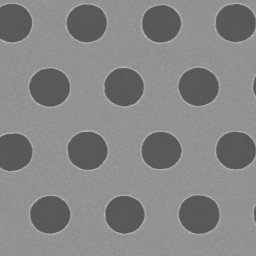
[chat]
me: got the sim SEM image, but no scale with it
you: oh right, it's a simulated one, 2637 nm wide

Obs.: a regular array of holes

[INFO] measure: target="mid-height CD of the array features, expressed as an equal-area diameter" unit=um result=0.403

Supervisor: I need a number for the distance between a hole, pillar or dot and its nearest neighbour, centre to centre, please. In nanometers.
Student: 759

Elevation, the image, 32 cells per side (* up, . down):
*.******************************
....*****....*****....*****.....
....****.....*****.....****.....
....****.....*****.....****.....
...******....*****....******...*
********************************
********************************
********************************
***************.****************
****....*****....******....*****
****.....****.....****.....*****
****.....****.....****.....*****
****....******...******....*****
********************************
********************************
********************************
**********.******************.**
....*****....*****....*****.....
....****.....*****.....****.....
....*****....*****.....****.....
...******....*****....******...*
********************************
********************************
********************************
***************.********..******
****....******....*****....*****
****.....****.....****.....*****
****.....****.....****.....*****
****....******...******....*****
********************************
********************************
********************************